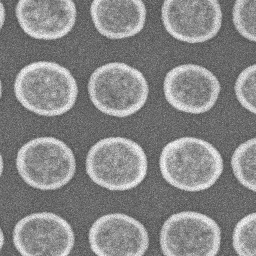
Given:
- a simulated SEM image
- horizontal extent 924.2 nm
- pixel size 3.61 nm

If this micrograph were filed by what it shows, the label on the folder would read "raised bodies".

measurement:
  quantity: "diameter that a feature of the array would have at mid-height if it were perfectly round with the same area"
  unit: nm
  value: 188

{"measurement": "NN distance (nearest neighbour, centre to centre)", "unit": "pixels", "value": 72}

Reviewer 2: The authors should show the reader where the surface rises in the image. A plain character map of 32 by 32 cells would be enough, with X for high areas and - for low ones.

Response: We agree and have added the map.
---XXXXXX---XXXXXX---XXXXXX---XX
--XXXXXXX---XXXXXX---XXXXXX--XXX
---XXXXXX---XXXXXX---XXXXXX--XXX
---XXXXXX---XXXXX----XXXXXX---XX
-----XX---------------XXXX-----X
--------------------------------
--------------------------------
--------------------------------
----XXX------XXX-------XX------X
--XXXXXXX---XXXXX----XXXXX----XX
--XXXXXXX--XXXXXXX---XXXXXX---XX
--XXXXXXX--XXXXXXX---XXXXXX---XX
---XXXXXX---XXXXXX---XXXXXX---XX
----XXXX-----XXXX------XXX-----X
--------------------------------
--------------------------------
--------------------------------
-----XX----------------X--------
---XXXXX----XXXXX----XXXXX----XX
---XXXXXX--XXXXXXX--XXXXXXX--XXX
--XXXXXXX--XXXXXXX--XXXXXXXX-XXX
---XXXXXX--XXXXXXX---XXXXXX---XX
---XXXXX----XXXXX----XXXXXX---XX
-----------------------XX-------
--------------------------------
--------------------------------
--------------------------------
---XXXXX-----XXXX----XXXXX-----X
--XXXXXXX---XXXXXX---XXXXXX---XX
--XXXXXXX--XXXXXXX--XXXXXXX---XX
--XXXXXXX---XXXXXX--XXXXXXX---XX
---XXXXX----XXXXXX---XXXXXX---XX